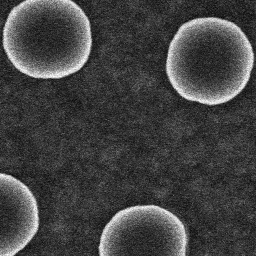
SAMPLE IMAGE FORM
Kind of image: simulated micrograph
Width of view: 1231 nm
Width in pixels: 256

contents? raised bodies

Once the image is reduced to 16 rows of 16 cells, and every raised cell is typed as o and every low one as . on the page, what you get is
.oooo...........
oooooo......oo..
oooooo.....oooo.
.oooo......ooooo
..oo.......ooooo
...........oooo.
................
................
................
................
................
o...............
oo..............
oo.....oooo.....
oo....oooooo....
o.....oooooo....